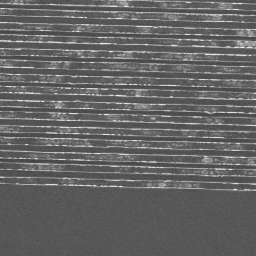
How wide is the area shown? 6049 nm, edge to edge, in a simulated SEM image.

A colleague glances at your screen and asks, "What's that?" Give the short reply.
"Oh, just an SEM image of parallel lines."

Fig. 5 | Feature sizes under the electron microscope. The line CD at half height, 165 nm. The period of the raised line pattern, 0.305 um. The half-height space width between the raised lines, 133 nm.